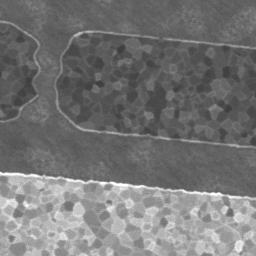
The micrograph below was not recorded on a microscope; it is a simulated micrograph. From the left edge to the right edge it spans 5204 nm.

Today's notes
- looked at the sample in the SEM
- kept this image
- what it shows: one or a few lines or trenches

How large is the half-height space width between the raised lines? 1040 nanometres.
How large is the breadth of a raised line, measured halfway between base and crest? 2.01 microns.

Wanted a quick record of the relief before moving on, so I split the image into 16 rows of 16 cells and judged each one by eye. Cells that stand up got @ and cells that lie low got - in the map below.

----------------
@---------------
@@---@@@@@@-----
@@--@@@@@@@@@@@@
@@--@@@@@@@@@@@@
@@--@@@@@@@@@@@@
@@--@@@@@@@@@@@@
@---@@@@@@@@@@@@
---------@@@@@@@
----------------
----------------
@@@@@@@---------
@@@@@@@@@@@@@@@@
@@@@@@@@@@@@@@@@
@@@@@@@@@@@@@@@@
@@@@@@@@@@@@@@@@